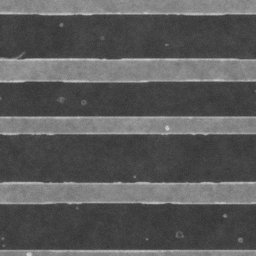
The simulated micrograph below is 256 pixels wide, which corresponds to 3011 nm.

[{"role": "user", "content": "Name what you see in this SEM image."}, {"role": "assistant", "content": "lines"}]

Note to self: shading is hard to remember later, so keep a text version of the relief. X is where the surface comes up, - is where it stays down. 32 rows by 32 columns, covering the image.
XXXXXXXXXXXXXXXXXXXXXXXXXXXXXXXX
XXXXXXXXXXXXXXXXXXXXXXXXXXXXXXXX
--------------------------------
--------------------------------
--------------------------------
--------------------------------
--------------------------------
X--XXXXXXXXX---XXXXXXXXXXXXXXX--
XXXXXXXXXXXXXXXXXXXXXXXXXXXXXXXX
XXXXXXXXXXXXXXXXXXXXXXXXXXXXXXXX
--------------------------------
--------------------------------
--------------------------------
--------------------------------
--------------------------------
XXXXXXXXXXXXXXXXXXXXXXXXXXXXXXXX
XXXXXXXXXXXXXXXXXXXXXXXXXXXXXXXX
--------------------------------
--------------------------------
--------------------------------
--------------------------------
--------------------------------
--------------------------------
XXXXXXXXXXXXXXXXXXXXXXXXXXXXXXXX
XXXXXXXXXXXXXXXXXXXXXXXXXXXXXXXX
--------------------------------
--------------------------------
--------------------------------
--------------------------------
--------------------------------
--------------------------------
XXXXXXXXXXXXXXXXXXXXXXXXXXXXXXXX